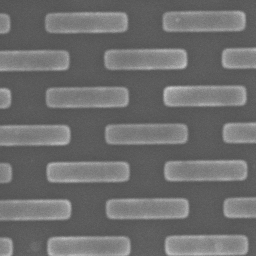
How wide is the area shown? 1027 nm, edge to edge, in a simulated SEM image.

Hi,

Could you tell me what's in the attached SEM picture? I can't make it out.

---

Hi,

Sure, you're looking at groups of lines, slits or small figures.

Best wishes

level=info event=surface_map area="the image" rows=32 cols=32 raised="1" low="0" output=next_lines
00000000000000000000000000000000
00000000000000000000000001111100
10000011111111110000111111111110
10000011111111110000011111111100
00000000000000000000000000000000
00000000000000000000000000000000
11111111000001111111111000001111
11111111100001111111111000001111
11111111000000111111100000000000
00000000000000000000000000000000
00000000000000000000000000000000
10000011111111110000011111111110
10000011111111110000011111111110
00000000000000000000000000000000
00000000000000000000000000000000
00000000000000000000000000000111
11111111100001111111111000001111
11111111100001111111111000001111
00000000000000000000000000000000
00000000000000000000000000000000
10000011111111110000011111111110
10000011111111110000011111111110
10000011111111110000000000000000
00000000000000000000000000000000
00000000000000000000000000000000
11111111100001111111111000001111
11111111100001111111111000001111
00000000000000000000000000000000
00000000000000000000000000000000
00000000000000000000000011111100
10000011111111110000011111111110
10000011111111110000011111111110